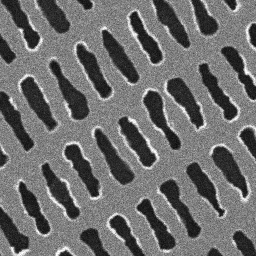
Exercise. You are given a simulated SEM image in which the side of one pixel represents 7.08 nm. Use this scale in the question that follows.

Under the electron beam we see a regular array of holes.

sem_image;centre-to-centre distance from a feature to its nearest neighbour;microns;0.219